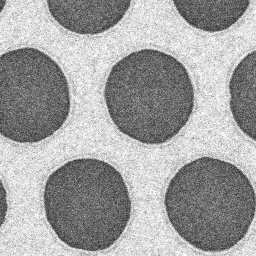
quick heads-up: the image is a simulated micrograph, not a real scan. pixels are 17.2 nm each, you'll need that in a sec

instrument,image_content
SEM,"holes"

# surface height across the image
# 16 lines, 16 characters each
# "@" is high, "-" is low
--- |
@@@-----@@@-----
@@@@---@@@@@---@
@@@@@@@@@@@@@@@@
---@@@@@---@@@@-
----@@@-----@@@-
----@@@-----@@--
----@@@-----@@--
----@@@-----@@@-
---@@@@@---@@@@-
@@@@@@@@@@@@@@@@
@@@@---@@@@----@
@@@-----@@@-----
@@@-----@@------
@@@-----@@------
@@@-----@@@----@
@@@@@--@@@@@--@@